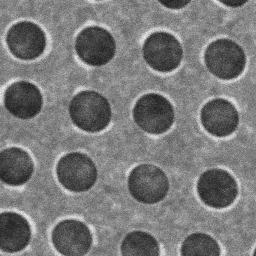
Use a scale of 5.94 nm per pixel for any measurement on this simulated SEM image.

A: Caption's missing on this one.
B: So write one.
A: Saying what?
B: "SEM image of a regular array of holes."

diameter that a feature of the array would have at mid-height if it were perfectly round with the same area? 247 nm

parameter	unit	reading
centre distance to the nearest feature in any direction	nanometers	370